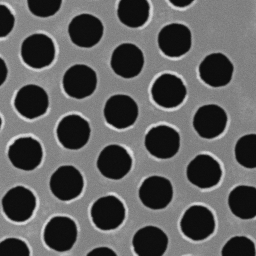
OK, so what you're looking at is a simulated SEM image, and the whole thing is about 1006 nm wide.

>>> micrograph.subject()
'a regular array of holes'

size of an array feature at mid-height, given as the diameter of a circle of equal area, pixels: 33.9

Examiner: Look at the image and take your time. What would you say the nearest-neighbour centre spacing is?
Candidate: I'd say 50.9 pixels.